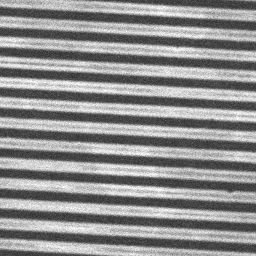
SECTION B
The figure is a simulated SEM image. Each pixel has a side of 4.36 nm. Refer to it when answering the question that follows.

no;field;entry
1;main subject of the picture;parallel lines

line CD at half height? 8.49 pixels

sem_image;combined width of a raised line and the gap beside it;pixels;20.2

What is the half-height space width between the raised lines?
0.0522 microns